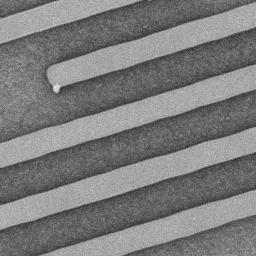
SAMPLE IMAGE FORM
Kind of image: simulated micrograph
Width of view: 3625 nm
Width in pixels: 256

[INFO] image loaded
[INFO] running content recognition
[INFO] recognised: groups of lines, slits or small figures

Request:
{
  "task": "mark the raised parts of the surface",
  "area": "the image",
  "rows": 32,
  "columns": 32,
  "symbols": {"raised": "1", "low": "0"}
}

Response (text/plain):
00000011111111110000000000000001
00011111111110000000000000001111
11111111110000000000000001111111
11111100000000000000001111111110
11100000000000000001111111111000
00000000000000011111111110000000
00000000000011111111110000000000
00000000011111111100000000000000
00000011111111110000000000000001
00000011111100000000000000011111
00000011100000000000000011111111
00000000000000000000011111111110
00000000000000000011111111110000
00000000000000011111111100000000
00000000000111111111100000000000
00000000111111111100000000000000
00001111111111100000000000000011
00111111111000000000000000011111
11111111000000000000000011111111
11111000000000000000111111111100
10000000000000000111111111100000
00000000000000111111111100000000
00000000001111111111000000000000
00000001111111111000000000000000
00001111111111000000000000000111
01111111111000000000000000111111
11111110000000000000000111111111
11110000000000000000111111111000
10000000000000001111111111000000
00000000000001111111111000000000
00000000001111111111000000000000
00000011111111110000000000000000